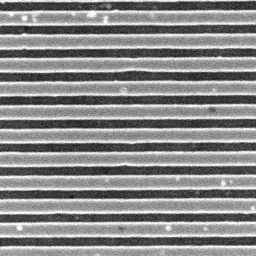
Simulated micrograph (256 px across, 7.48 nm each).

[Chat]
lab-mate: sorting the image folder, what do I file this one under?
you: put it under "parallel lines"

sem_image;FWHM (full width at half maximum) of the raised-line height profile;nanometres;100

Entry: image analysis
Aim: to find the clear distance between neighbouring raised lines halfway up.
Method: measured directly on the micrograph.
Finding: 74.8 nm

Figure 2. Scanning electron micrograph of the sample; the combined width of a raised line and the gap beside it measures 176 nanometres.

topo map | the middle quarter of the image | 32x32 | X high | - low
XXXXXXXXXXXXXXXXXXXXXXXXXXXXXXXX
XXXXXXXXXXXXXXXX----XXXXXXXXXXXX
--------------------------------
--------------------------------
------------XX---XXXXXXXXXXXX---
XXXXXXXXXXXXXXXXXXXXXXXXXXXXXXXX
XXXXXXXXXXXXXXXXXXXXXXXXXXXXXXXX
XXXXXXXXXXXXXXXXXXXXXXXXXXXXXXXX
--------------------------------
--------------------------------
XXXXX-----XXXXXXXXXXXXXXXXXXXXXX
XXXXXXXXXXXXXXXXXXXXXXXXXXXXXXXX
XXXXXXXXXXXXXXXXXXXXXXXXXXXXXXXX
XXXXXXXXXXXXXXXXXXXXXXXXXXXXXXXX
--------------------------------
--------------------------------
XXXXXXXXXXXXXXXXXXXXXXXXXXXXXXXX
XXXXXXXXXXXXXXXXXXXXXXXXXXXXXXXX
XXXXXXXXXXXXXXXXXXXXXXXXXXXXXXXX
XXXXX---------XXXX--------------
--------------------------------
--------------------------------
XXXXXXXXXXXXXXXXXXXXXXXXXXXXXXXX
XXXXXXXXXXXXXXXXXXXXXXXXXXXXXXXX
XXXXXXXXXXXXXXXXXXXXXXXXXXXXXXXX
--------------------------------
--------------------------------
--------------------------------
XXXXXXXXXXXXXXXXXXXXXXXXXXXXXXXX
XXXXXXXXXXXXXXXXXXXXXXXXXXXXXXXX
XXXXXXXXXXXXXXXXXXXXXXXXXXXXXXXX
--------------------------------